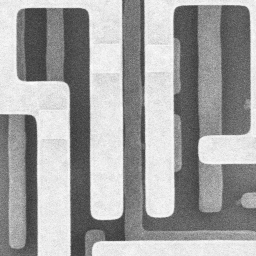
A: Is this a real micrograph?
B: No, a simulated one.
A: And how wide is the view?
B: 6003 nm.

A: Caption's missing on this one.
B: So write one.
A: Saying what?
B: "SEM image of wiring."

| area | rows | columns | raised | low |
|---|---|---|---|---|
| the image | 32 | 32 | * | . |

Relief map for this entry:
***************...**************
**.........****...****.........*
**.........****...****.........*
**.........****...****.........*
**.........****...****.........*
**.........****...****.........*
**.........****...****.........*
**.........****...****.........*
**.........****...****.........*
**.........****...****.........*
********...****...****.........*
*********..****...****.........*
*********..****...****.........*
*********..****...****.........*
....*****..****...****.........*
.....****..****...****.........*
.....****..****...****.........*
.....****..****...****...*******
.....****..****...****...*******
.....****..****...****...*******
.....****..****...****..........
.....****..****...****..........
.....****..****...****..........
.....****..****...****..........
.....****..****...****..........
.....****..****...****..........
.....****..****...****..........
.....****.......................
.....****.......................
.....****.......................
.....****...********************
.....****...********************